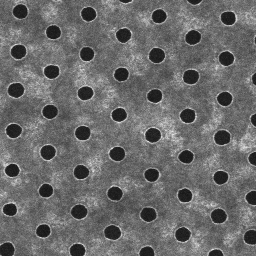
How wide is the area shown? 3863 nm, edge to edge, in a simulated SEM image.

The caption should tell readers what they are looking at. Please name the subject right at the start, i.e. a regular array of holes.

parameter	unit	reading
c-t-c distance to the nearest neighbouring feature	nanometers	589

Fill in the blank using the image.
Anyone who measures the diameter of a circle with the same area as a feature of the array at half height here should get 226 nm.